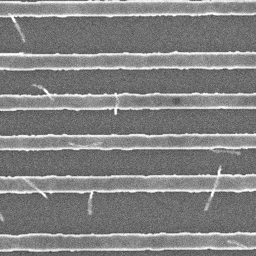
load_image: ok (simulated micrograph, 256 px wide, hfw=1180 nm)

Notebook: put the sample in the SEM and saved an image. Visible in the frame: lines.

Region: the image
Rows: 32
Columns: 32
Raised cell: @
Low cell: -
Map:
@@@@@@@@@@@@@@@@@@@@@@@@@@@@@@@@
@@@@@@@@@@@@@@@@@@@@@@@@@@@@@@@@
--------------------------------
--------------------------------
--------------------------------
--------------------------------
----------------------@------@@@
@@@@@@@@@@@@@@@@@@@@@@@@@@@@@@@@
@@@@@@@@@@@@@@@@@@@@--@@-@@@@@--
--------------------------------
--------------------------------
--------------------------------
@@@@@@@@@@@@@@@@@@@@@@@@@@@@@@@@
@@@@@@@@@@@@@@@@@@@@@@@@@@@@@@@@
--------------------------------
--------------------------------
--------------------------------
@@@@@@@@@@@@@@@@@@@@@@@@@@@@@@@@
@@@@@@@@@@@@@@@@@@@@@@@@@@@-@@@-
--------------------------------
--------------------------------
--------------------------------
@@@@@@@@@@@@@@@@@@@@@@@@@@@@@@@@
@@@@@@@@@@@@@@@@@@@@@@@@@@@@@@@@
--------------------------------
--------------------------------
--------------------------------
--------------------------------
--------------------------------
@@@@@@@@@@@@@@@@@@@@@@@@@@@@@@@@
@@@@@@@@@@@@@@@@@@@@@@@@@@@@@@@@
--------------------------------